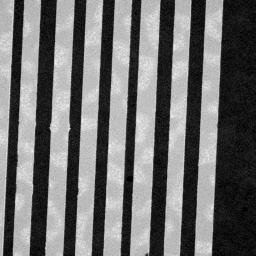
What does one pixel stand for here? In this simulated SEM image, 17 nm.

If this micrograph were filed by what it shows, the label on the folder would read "parallel lines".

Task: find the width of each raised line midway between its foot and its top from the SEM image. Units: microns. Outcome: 0.283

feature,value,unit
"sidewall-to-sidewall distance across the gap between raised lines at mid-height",202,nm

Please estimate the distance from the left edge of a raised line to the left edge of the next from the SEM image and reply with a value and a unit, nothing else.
516 nm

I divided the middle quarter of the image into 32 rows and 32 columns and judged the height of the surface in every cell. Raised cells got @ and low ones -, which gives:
@@---@@@@---@@@@---@@@@----@@@@-
@@---@@@@---@@@@---@@@@----@@@@-
@@---@@@@---@@@@---@@@@----@@@@-
@@---@@@@---@@@@---@@@@----@@@@-
@@---@@@@---@@@@---@@@@----@@@@-
@@---@@@@---@@@@---@@@@----@@@@-
@@---@@@@---@@@@--@@@@@----@@@@-
@----@@@@---@@@@--@@@@@----@@@@-
@----@@@@---@@@@--@@@@@----@@@@-
@----@@@@---@@@@--@@@@@----@@@@-
@----@@@----@@@@--@@@@@----@@@@-
@---@@@@----@@@@--@@@@@----@@@--
@---@@@@----@@@---@@@@@-----@@--
@---@@@@----@@@---@@@@@----@@@--
@---@@@@---@@@@---@@@@@----@@@--
@---@@@@---@@@@---@@@@@----@@@--
@---@@@@---@@@@---@@@@@---@@@@--
@---@@@@---@@@@---@@@@----@-@@--
@---@@@@---@@@@---@@@@----@-@@--
@---@@@@---@@@@---@@@@----@@@@--
@---@@@@---@-@@---@@@@----@@@@--
@---@@@@---@@@@---@@@@----@@@@--
@---@@@@---@@@@---@@@@----@@@@--
@---@@@@---@@@@---@@@@----@@@@--
@---@@@@---@@@@---@@@@----@@@@--
@---@@@@---@@@@---@@@@----@@@@--
@---@@@@---@@@@---@@@@----@@@@--
@---@@@@---@@@@---@@@@----@@@@--
@---@@@@---@@@@--@@@@@----@@@@--
@---@@@@---@@@@--@@@@@----@@@@--
----@@@@---@@@@--@@@@@----@@@@--
----@@@@---@@@@--@@@@@----@@@@--